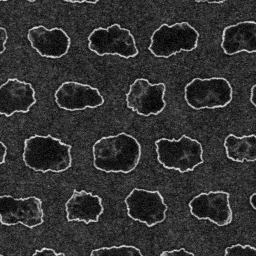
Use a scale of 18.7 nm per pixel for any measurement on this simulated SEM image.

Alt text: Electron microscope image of a regular array of raised bodies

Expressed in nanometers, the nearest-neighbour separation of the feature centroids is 1160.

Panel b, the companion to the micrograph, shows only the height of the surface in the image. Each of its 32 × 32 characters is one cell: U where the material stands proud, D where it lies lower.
DDDDDDDDDDDDDDDDDDDDDDDDDDDDDDDD
DDDDDDDDDDDDDDDDDDDDDDDDDDDDDDDD
DDDDDDDDDDDDDDDDDDDDDDDDDDDDDDDD
DDDDUUDDDDDDDUUDDDDDUUUUDDDDUUUU
UDDDUUUUDDDUUUUUDDDUUUUUUDDDUUUU
UDDDUUUUUDDUUUUUUDDUUUUUUDDDUUUU
DDDDDUUUDDDDUUUUUDDUUUDDDDDDUUDD
DDDDDDDDDDDDDDDDDDDDDDDDDDDDDDDD
DDDDDDDDDDDDDDDDDDDDDDDDDDDDDDDD
DDDDDDDDDDDDDDDDDDDDDDDDDDDDDDDD
DUUUDDDDUUDDDDDDDUUDDDDDUUUUUDDD
UUUUDDDUUUUUDDDDUUUUUDDUUUUUUDDU
UUUUDDDUUUUUUDDDUUUUUDDUUUUUUDDU
UUUUDDDDUUUDDDDDUUUUDDDDUDDDDDDD
DDDDDDDDDDDDDDDDDDDDDDDDDDDDDDDD
DDDDDDDDDDDDDDDDDDDDDDDDDDDDDDDD
DDDDDDDDDDDDDDDDDDDDDDDDDDDDDDDD
DDDUUUUDDDDDUUUUUDDDUUUUDDDDUUUU
UDDUUUUUUDDDUUUUUDDDUUUUUDDDUUUU
UDDUUUUUUDDDUUUUUDDDUUUUUDDDDUUU
DDDUUUUUUDDDUUUUUDDDUUUUUDDDDDDD
DDDDDDDDDDDDDDUUDDDDDDDDDDDDDDDD
DDDDDDDDDDDDDDDDDDDDDDDDDDDDDDDD
DDDDDDDDDDDDDDDDDDDDDDDDDDDDDDDD
DDDDDDDDDUUUDDDDUUUUDDDDDUUUDDDD
UUUUUDDDUUUUUDDDUUUUUDDDUUUUUDDU
UUUUUDDDUUUUUDDDUUUUUDDDUUUUUDDD
UUUUUDDDDDUUDDDDDUUUDDDDDDUUUDDD
DDDDDDDDDDDDDDDDDDDDDDDDDDDDDDDD
DDDDDDDDDDDDDDDDDDDDDDDDDDDDDDDD
DDDDDDDDDDDDDDDDDDDDDDDDDDDDDDDD
DDDDDUUDDDDDUUUUUDDDDUUDDDDDUUUU